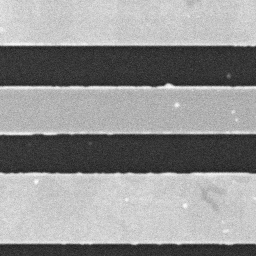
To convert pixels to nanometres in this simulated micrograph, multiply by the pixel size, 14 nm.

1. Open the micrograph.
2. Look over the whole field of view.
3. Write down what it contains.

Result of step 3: lines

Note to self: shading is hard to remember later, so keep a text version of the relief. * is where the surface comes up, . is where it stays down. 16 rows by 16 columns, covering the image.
****************
****************
****************
................
................
****************
****************
****************
................
................
................
****************
****************
****************
****************
................